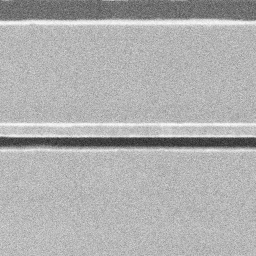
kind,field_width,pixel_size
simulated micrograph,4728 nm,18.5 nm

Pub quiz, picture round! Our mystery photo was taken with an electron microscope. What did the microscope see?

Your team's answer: lines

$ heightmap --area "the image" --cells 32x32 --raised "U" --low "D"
DDDDDDDDDDDDDDDDDDDDDDDDDDDDDDDD
DDDDDDDDDDDDDDDDDDDDDDDDDDDDDDDD
DDDDDDDDDDDDDDDDDDDDDDDDDDDDDDDD
UUUUUUUUUUUUUUUUUUUUUUUUUUUUUUUU
UUUUUUUUUUUUUUUUUUUUUUUUUUUUUUUU
UUUUUUUUUUUUUUUUUUUUUUUUUUUUUUUU
UUUUUUUUUUUUUUUUUUUUUUUUUUUUUUUU
UUUUUUUUUUUUUUUUUUUUUUUUUUUUUUUU
UUUUUUUUUUUUUUUUUUUUUUUUUUUUUUUU
UUUUUUUUUUUUUUUUUUUUUUUUUUUUUUUU
UUUUUUUUUUUUUUUUUUUUUUUUUUUUUUUU
UUUUUUUUUUUUUUUUUUUUUUUUUUUUUUUU
UUUUUUUUUUUUUUUUUUUUUUUUUUUUUUUU
UUUUUUUUUUUUUUUUUUUUUUUUUUUUUUUU
UUUUUUUUUUUUUUUUUUUUUUUUUUUUUUUU
UUUUUUUUUUUUUUUUUUUUUUUUUUUUUUUU
UUUUUUUUUUUUUUUUUUUUUUUUUUUUUUUU
DDDDDDDDDDDDDDDDDDDDDDDDDDDDDDDD
DDDDDDDDDDDDDDDDDDDDDDDDDDDDDDDD
UUUUUUUUUUUUUUUUUUUUUUUUUUUUUUUU
UUUUUUUUUUUUUUUUUUUUUUUUUUUUUUUU
UUUUUUUUUUUUUUUUUUUUUUUUUUUUUUUU
UUUUUUUUUUUUUUUUUUUUUUUUUUUUUUUU
UUUUUUUUUUUUUUUUUUUUUUUUUUUUUUUU
UUUUUUUUUUUUUUUUUUUUUUUUUUUUUUUU
UUUUUUUUUUUUUUUUUUUUUUUUUUUUUUUU
UUUUUUUUUUUUUUUUUUUUUUUUUUUUUUUU
UUUUUUUUUUUUUUUUUUUUUUUUUUUUUUUU
UUUUUUUUUUUUUUUUUUUUUUUUUUUUUUUU
UUUUUUUUUUUUUUUUUUUUUUUUUUUUUUUU
UUUUUUUUUUUUUUUUUUUUUUUUUUUUUUUU
UUUUUUUUUUUUUUUUUUUUUUUUUUUUUUUU